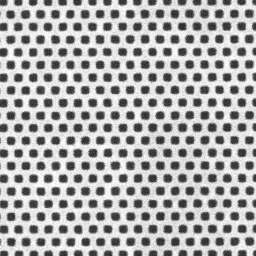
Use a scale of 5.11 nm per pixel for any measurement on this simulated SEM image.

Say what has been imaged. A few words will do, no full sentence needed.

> a regular array of holes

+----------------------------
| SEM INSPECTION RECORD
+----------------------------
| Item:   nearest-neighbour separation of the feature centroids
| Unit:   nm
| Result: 73.8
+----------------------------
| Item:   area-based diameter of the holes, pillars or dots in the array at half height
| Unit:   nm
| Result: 47.9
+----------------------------